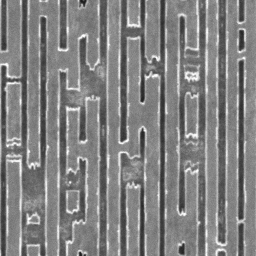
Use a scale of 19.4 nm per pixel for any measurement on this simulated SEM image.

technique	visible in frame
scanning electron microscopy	parallel lines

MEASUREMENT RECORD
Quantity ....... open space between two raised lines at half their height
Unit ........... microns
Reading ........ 0.117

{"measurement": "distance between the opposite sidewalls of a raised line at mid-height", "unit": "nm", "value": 253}